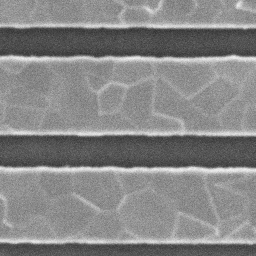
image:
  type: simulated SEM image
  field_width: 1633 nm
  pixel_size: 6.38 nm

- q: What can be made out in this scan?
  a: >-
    lines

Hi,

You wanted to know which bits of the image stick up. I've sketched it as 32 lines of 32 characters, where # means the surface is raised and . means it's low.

################################
################################
################################
................................
................................
................................
................................
################################
################################
################################
################################
################################
################################
################################
################################
################################
################################
................................
................................
................................
................................
################################
################################
################################
################################
################################
################################
################################
################################
################################
................................
................................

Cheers